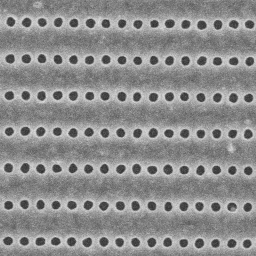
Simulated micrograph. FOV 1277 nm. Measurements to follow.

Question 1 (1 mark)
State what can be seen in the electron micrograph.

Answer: a regular array of holes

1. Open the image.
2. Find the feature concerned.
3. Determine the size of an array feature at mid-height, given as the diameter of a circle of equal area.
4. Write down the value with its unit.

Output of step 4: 45.8 nm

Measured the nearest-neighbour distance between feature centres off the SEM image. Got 78.6 nanometres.